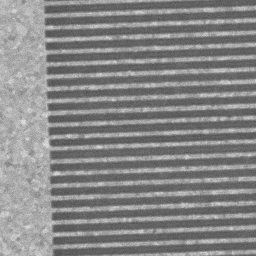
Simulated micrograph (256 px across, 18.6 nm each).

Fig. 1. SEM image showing parallel lines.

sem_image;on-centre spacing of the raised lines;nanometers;226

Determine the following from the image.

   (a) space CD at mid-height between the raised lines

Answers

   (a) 0.141 microns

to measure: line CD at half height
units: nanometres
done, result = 88.2